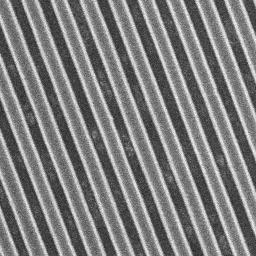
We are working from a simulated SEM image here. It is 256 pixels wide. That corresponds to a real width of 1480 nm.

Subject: parallel lines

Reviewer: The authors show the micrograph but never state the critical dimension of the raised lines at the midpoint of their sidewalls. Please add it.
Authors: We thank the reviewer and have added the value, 80.4 nanometers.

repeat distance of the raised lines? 0.157 µm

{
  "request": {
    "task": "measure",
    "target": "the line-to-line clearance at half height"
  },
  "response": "0.0804 micrometres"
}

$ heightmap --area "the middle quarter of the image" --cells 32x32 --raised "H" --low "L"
LLLHHHHLLLHHHHLLLLHHHLLLLHHHLLLL
LLLLHHHLLLLHHHLLLLHHHHLLLHHHHLLL
LLLLHHHLLLLHHHHLLLHHHHLLLLHHHLLL
HLLLHHHHLLLLHHHLLLLHHHLLLLHHHHLL
HLLLLHHHLLLLHHHHLLLHHHHLLLLHHHLL
HLLLLHHHHLLLHHHHLLLHHHHLLLLHHHLL
HHLLLHHHHLLLLHHHLLLLHHHHLLLHHHHL
HHLLLLHHHLLLLHHHHLLLHHHHLLLLHHHL
HHLLLLHHHHLLLHHHHLLLLHHHLLLLHHHH
HHHLLLHHHHLLLLHHHLLLLHHHHLLLHHHH
HHHLLLLHHHLLLLHHHHLLLHHHHLLLLHHH
HHHHLLLHHHHLLLHHHHLLLLHHHLLLLHHH
HHHHLLLHHHHLLLLHHHHLLLHHHHLLLHHH
LHHHLLLLHHHHLLLHHHHLLLHHHHLLLLHH
LHHHHLLLHHHHLLLHHHHLLLLHHHHLLLHH
LHHHHLLLLHHHLLLLHHHHLLLHHHHLLLLH
LLHHHLLLLHHHHLLLHHHHLLLLHHHLLLLH
LLHHHHLLLLHHHLLLLHHHLLLLHHHHLLLH
LLLHHHLLLLHHHHLLLHHHHLLLHHHHLLLL
LLLHHHHLLLHHHHLLLHHHHLLLLHHHLLLL
LLLHHHHLLLLHHHLLLLHHHHLLLHHHHLLL
LLLLHHHHLLLHHHHLLLHHHHLLLLHHHLLL
HLLLHHHHLLLHHHHLLLHHHHLLLLHHHHLL
HLLLHHHHLLLLHHHLLLLHHHHLLLHHHHLL
HLLLLHHHHLLLHHHHLLLHHHHLLLLHHHLL
HHLLLHHHHLLLHHHHLLLLHHHHLLLHHHHL
HHLLLLHHHLLLLHHHLLLLHHHHLLLHHHHL
HHHLLLHHHHLLLHHHHLLLHHHHLLLLHHHL
HHHLLLHHHHLLLLHHHLLLLHHHHLLLHHHH
HHHLLLLHHHHLLLHHHHLLLHHHHLLLLHHH
HHHHLLLHHHHLLLHHHHLLLHHHHLLLLHHH
HHHHLLLHHHHLLLLHHHLLLLHHHHLLLHHH